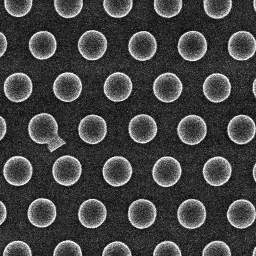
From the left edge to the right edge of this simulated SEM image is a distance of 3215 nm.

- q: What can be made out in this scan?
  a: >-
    a regular array of raised bodies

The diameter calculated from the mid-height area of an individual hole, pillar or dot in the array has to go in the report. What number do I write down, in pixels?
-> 28.3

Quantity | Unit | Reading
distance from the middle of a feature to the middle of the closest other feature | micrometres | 0.608